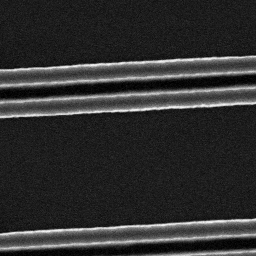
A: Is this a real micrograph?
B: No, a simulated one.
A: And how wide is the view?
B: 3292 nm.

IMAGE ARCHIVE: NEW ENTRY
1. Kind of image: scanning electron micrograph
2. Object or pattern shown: lines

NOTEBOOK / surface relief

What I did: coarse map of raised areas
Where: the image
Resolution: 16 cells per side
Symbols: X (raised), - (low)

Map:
----------------
----------------
----------------
----------------
XXXXXXXXXXXXXXXX
XXXXXXXXXXXXXXXX
XXXXXXXXXXXXXX--
----------------
----------------
----------------
----------------
----------------
----------------
----------------
--XXXXXXXXXXXXXX
XXXXXXXXXXXXXXXX